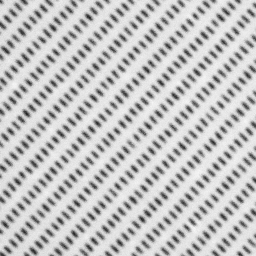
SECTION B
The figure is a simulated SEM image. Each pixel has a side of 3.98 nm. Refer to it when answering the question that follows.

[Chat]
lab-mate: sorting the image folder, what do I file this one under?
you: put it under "a regular array of holes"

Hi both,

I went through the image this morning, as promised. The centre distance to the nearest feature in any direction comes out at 0.0316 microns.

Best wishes